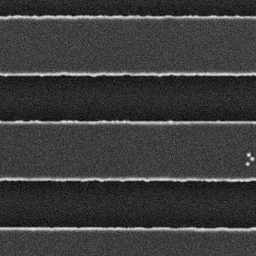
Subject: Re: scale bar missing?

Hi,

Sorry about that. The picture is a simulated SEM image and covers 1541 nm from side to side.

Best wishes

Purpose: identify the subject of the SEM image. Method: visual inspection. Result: lines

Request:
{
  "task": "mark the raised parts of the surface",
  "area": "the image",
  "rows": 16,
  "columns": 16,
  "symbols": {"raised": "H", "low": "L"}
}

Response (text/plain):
LLLLLLLLLLLLLLLL
HHHHHHHHHHHHHHHH
HHHHHHHHHHHHHHHH
HHHHHHHHHHHHHHHH
HHHHHHHHHHHHHHHH
LLLLLLLLLLLLLLLL
LLLLLLLLLLLLLLLL
LLLLLLLLLLLLLLLL
HHHHHHHHHHHHHHHH
HHHHHHHHHHHHHHHH
HHHHHHHHHHHHHHHH
LLLLLLLLLLLLLLLL
LLLLLLLLLLLLLLLL
LLLLLLLLLLLLLLLL
HHHHHHHHHHHHHHHH
HHHHHHHHHHHHHHHH